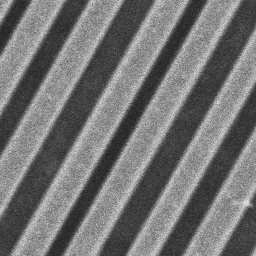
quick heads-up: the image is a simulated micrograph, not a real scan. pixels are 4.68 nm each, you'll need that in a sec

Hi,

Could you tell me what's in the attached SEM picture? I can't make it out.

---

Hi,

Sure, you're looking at parallel lines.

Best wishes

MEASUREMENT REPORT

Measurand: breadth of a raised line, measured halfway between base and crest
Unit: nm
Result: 135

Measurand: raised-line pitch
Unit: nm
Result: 239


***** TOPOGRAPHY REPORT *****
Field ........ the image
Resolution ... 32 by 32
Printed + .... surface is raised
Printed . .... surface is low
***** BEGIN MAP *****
+...++++...++++....++++...++++..
+..++++...+++++....++++..++++...
...++++...++++....++++...++++...
..++++...++++.....++++..++++....
.+++++...++++....++++..+++++....
.++++...++++....+++++..++++....+
++++....++++....++++..++++....++
++++...++++....++++...++++....++
+++...+++++....++++..++++....+++
+++...++++....++++...++++....+++
++...++++.....++++..++++....++++
++...++++....++++..+++++....+++.
+...++++.....++++..++++....++++.
....++++....++++..++++....++++..
...++++....++++...++++....+++...
...+++.....++++..++++....++++...
..++++....++++...++++....+++....
.++++.....++++..++++....++++...+
.++++....++++..+++++....+++....+
++++.....++++..++++....++++...++
++++....++++..++++....++++...+++
+++....+++++..++++....+++....+++
+++....++++..++++....++++...++++
++....++++...++++....+++....++++
+.....++++..++++....++++...+++++
+....++++...++++....+++....++++.
.....++++..++++....++++...++++..
....++++..++++....++++...+++++..
...+++++..++++....++++...++++...
...++++..++++....++++...+++++...
..++++...++++....+++....++++....
..++++..++++....++++...+++++....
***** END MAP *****